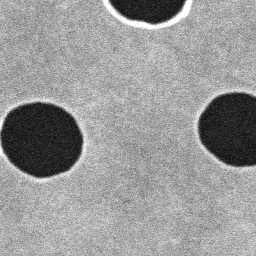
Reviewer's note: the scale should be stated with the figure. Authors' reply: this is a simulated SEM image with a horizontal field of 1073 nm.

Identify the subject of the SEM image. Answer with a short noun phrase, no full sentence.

holes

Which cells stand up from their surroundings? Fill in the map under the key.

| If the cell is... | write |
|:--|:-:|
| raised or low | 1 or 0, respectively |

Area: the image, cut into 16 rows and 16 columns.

1111111000011111
1111111111111111
1111111111111111
1111111111111111
1111111111111111
1111111111111111
1101111111111000
0000011111110000
0000011111110000
0000011111111000
1000111111111111
1111111111111111
1111111111111111
1111111111111111
1111111111111111
1111111111111111